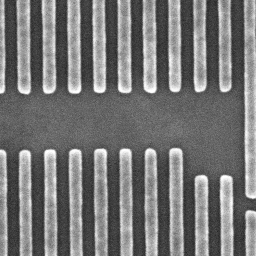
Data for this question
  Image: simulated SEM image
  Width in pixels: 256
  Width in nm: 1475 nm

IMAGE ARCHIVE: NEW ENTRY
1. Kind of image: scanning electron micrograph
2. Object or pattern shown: wiring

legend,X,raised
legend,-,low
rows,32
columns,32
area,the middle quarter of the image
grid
-XXX----XX----XXX---XXX----XX---
-XXX----XX----XXX---XXX----XX---
-XXX----XX----XXX---XXX----XX---
-XXX----XX----XXX---XXX----XX---
-XXX----XX----XXX---XXX----XX---
-XXX----XX----XXX---XXX----XX---
-XXX----XX----XXX---XXX----XX---
--------------------------------
--------------------------------
--------------------------------
--------------------------------
--------------------------------
--------------------------------
--------------------------------
--------------------------------
--------------------------------
--------------------------------
--------------------------------
--------------------------------
--------------------------------
--------------------------------
---------------------X-----XX---
-XXX----XX----XXX---XXX----XX---
-XXX----XX----XXX---XXX----XX---
-XXX----XX----XXX---XXX----XX---
-XXX----XX----XXX---XXX----XX---
-XXX----XX----XXX---XXX----XX---
-XXX----XX----XXX---XXX----XX---
-XXX----XX----XXX---XXX----XX---
-XXX----XX----XXX---XXX----XX---
-XXX----XXX---XXX---XXX----XX---
-XXX----XXX---XXX---XXX----XX---